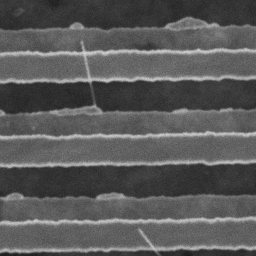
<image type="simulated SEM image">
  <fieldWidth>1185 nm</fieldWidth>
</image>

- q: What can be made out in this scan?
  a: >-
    lines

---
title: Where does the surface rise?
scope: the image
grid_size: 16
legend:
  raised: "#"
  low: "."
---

................
...........##...
################
################
################
................
................
################
################
################
................
................
################
################
################
################